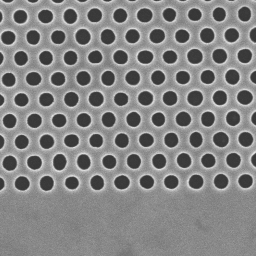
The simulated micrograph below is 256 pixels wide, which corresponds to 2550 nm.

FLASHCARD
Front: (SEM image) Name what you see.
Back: a regular array of holes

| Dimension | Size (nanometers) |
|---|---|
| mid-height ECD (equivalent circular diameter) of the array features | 145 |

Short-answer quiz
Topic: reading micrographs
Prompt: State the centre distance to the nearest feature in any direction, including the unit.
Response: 23.9 pixels